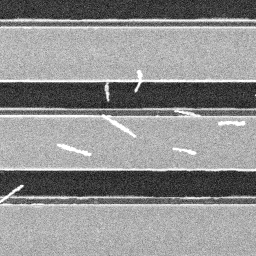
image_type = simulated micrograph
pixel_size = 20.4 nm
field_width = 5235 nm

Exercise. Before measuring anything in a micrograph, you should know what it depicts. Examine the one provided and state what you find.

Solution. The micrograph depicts lines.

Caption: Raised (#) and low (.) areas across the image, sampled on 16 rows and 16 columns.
................
................
################
################
################
................
................
################
################
################
################
................
................
################
################
################